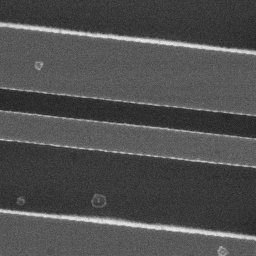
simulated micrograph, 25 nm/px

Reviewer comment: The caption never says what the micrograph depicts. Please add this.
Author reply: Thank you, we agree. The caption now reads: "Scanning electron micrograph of lines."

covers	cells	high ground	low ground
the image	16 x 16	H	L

LLLLLLLLLLLLLLLL
LLLLLLLLLLLLLLLL
HHHHHHHHLLLLLLLL
HHHHHHHHHHHHHHHH
HHHHHHHHHHHHHHHH
HHHHHHHHHHHHHHHH
HHHHHHHHHHHHHHHH
HHHHHHHHHHHHHHHH
HHHHHHHHHHHHHHHH
LLLLLLLHHHHHHHHH
LLLLLLLLLLLLLLLL
LLLLLLLLLLLLLLLL
LLLLLLLLLLLLLLLL
HHHLLLLLLLLLLLLL
HHHHHHHHHHHHLLLL
HHHHHHHHHHHHHHHH